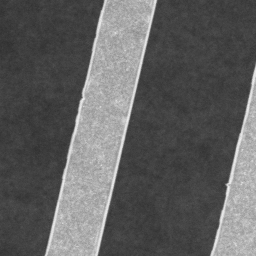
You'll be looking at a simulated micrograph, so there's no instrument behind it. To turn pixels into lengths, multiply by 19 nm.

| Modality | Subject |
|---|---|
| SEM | one or a few lines or trenches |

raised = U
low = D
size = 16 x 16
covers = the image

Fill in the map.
DDDDDDUUUUDDDDDD
DDDDDDUUUDDDDDDD
DDDDDDUUUDDDDDDD
DDDDDDUUUDDDDDDD
DDDDDDUUUDDDDDDD
DDDDDUUUDDDDDDDD
DDDDDUUUDDDDDDDD
DDDDDUUUDDDDDDDU
DDDDDUUUDDDDDDDU
DDDDUUUDDDDDDDDU
DDDDUUUDDDDDDDDU
DDDDUUUDDDDDDDUU
DDDDUUUDDDDDDDUU
DDDUUUUDDDDDDDUU
DDDUUUDDDDDDDDUU
DDDUUUDDDDDDDUUU